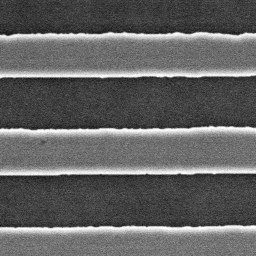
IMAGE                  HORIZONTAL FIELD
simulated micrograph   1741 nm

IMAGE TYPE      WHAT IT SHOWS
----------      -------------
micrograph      lines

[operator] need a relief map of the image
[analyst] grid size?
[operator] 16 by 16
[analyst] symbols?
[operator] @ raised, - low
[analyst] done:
----------------
----------------
@@@@@@@@@@@@@@@@
@@@@@@@@@@@@@@@@
@@@@@@@@@@@@@@@@
----------------
----------------
----------------
@@@@@@@@@@@@@@@@
@@@@@@@@@@@@@@@@
@@@@@@@@@@@@@@@@
----------------
----------------
----------------
@@@@@@@@@@@@@@@@
@@@@@@@@@@@@@@@@